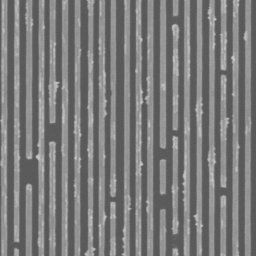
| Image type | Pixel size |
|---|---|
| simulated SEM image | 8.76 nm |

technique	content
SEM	parallel lines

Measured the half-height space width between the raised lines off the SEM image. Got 61.3 nanometers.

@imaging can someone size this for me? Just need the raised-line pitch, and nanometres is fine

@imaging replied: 107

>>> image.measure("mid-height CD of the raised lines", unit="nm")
46